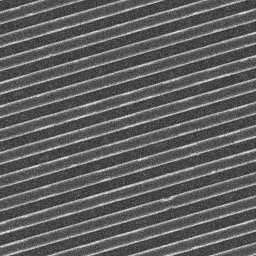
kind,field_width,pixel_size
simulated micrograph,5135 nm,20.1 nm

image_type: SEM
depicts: parallel lines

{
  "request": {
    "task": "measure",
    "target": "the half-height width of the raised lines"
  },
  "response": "0.236 um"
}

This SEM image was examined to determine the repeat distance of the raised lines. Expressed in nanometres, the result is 451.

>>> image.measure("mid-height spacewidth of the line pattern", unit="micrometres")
0.219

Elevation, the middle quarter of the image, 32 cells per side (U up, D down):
UUUUUUUUDDDDDDDDDDUUUUUUUUUUUDDD
UUUUUDDDDDDDDDDUUUUUUUUUUDDDDDDD
UDDDDDDDDDDUUUUUUUUUUUDDDDDDDDDD
DDDDDDDDUUUUUUUUUUDDDDDDDDDDUUUU
DDDDUUUUUUUUUUUDDDDDDDDDDUUUUUUU
DUUUUUUUUUUDDDDDDDDDDUUUUUUUUUUU
UUUUUUUUDDDDDDDDDDUUUUUUUUUUDDDD
UUUUUDDDDDDDDDDUUUUUUUUUUDDDDDDD
UDDDDDDDDDDUUUUUUUUUUUDDDDDDDDDU
DDDDDDDDUUUUUUUUUUDDDDDDDDDDUUUU
DDDDUUUUUUUUUUUDDDDDDDDDUUUUUUUU
DUUUUUUUUUUDDDDDDDDDUUUUUUUUUUUD
UUUUUUUUDDDDDDDDDUUUUUUUUUUDDDDD
UUUUDDDDDDDDDDUUUUUUUUUUDDDDDDDD
UDDDDDDDDDDUUUUUUUUUDDDDDDDDDDUU
DDDDDDDUUUUUUUUUUDDDDDDDDDDUUUUU
DDDDUUUUUUUUUDDDDDDDDDDUUUUUUUUU
UUUUUUUUUUDDDDDDDDDDUUUUUUUUUUDD
UUUUUUUDDDDDDDDDDUUUUUUUUUUDDDDD
UUUDDDDDDDDDDUUUUUUUUUUUDDDDDDDD
DDDDDDDDDDUUUUUUUUUUDDDDDDDDDDUU
DDDDDDDUUUUUUUUUUDDDDDDDDDDUUUUU
DDDUUUUUUUUUUDDDDDDDDDDUUUUUUUUU
UUUUUUUUUUDDDDDDDDDDUUUUUUUUUUDD
UUUUUUDDDDDDDDDDUUUUUUUUUUUDDDDD
UUUDDDDDDDDDDUUUUUUUUUUDDDDDDDDD
DDDDDDDDDUUUUUUUUUUUDDDDDDDDDDUU
DDDDDDUUUUUUUUUUDDDDDDDDDDUUUUUU
DDUUUUUUUUUUUDDDDDDDDDDUUUUUUUUU
UUUUUUUUUDDDDDDDDDDUUUUUUUUUUUDD
UUUUUUDDDDDDDDDDUUUUUUUUUUDDDDDD
UUDDDDDDDDDDUUUUUUUUUUUDDDDDDDDD